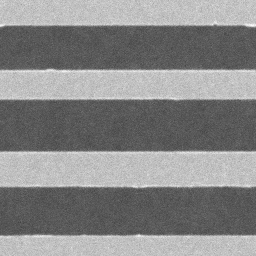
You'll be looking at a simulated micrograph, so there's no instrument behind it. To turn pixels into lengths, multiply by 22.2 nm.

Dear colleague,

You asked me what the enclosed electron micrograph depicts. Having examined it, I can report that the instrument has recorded one or a few lines or trenches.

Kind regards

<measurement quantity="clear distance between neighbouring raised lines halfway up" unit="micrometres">1.11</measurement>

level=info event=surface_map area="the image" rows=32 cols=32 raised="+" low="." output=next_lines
++++++++++++++++++++++++++++++++
++++++++++++++++++++++++++++++++
++++++++++++++++++++++++++++++++
................................
................................
................................
................................
................................
................................
++++++++++++++++++++++++++++++++
++++++++++++++++++++++++++++++++
++++++++++++++++++++++++++++++++
................................
................................
................................
................................
................................
................................
................................
++++++++++++++++++++++++++++++++
++++++++++++++++++++++++++++++++
++++++++++++++++++++++++++++++++
++++++++++++++++++++++++++++++++
................................
................................
................................
................................
................................
................................
...++++...+.....++..............
++++++++++++++++++++++++++++++++
++++++++++++++++++++++++++++++++